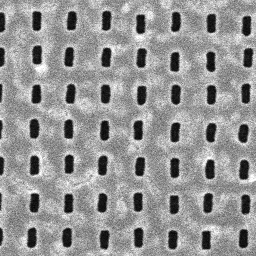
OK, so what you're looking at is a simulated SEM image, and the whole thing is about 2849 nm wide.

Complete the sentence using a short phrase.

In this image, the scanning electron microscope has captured a regular array of holes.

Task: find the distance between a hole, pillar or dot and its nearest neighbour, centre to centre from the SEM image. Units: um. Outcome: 0.378